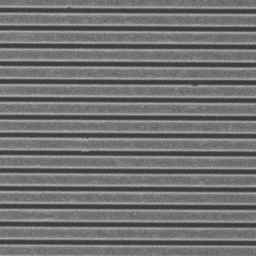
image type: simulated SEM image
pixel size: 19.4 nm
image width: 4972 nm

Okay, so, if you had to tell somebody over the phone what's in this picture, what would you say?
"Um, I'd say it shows parallel lines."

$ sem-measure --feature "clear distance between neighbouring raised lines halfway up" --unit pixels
5.75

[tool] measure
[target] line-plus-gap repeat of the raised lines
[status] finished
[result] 346 nanometres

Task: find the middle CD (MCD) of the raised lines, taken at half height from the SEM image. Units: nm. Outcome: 240